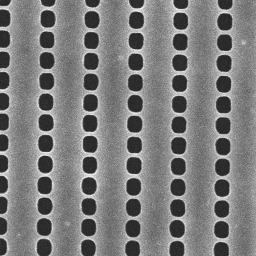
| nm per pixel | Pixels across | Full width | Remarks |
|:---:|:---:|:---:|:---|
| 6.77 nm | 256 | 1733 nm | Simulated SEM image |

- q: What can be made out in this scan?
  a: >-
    a regular array of holes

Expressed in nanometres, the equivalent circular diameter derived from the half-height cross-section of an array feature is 116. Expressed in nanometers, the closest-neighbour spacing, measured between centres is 140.